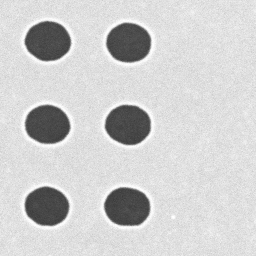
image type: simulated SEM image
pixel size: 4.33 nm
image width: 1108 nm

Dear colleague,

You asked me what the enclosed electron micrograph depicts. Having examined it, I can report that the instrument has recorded holes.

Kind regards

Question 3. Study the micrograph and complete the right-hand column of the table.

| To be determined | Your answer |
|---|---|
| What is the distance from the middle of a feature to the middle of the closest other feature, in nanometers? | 349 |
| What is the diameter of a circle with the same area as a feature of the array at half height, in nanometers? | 186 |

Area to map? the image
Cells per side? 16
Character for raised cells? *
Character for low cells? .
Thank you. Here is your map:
****************
**..************
**..***..*******
**..***..*******
****************
****************
****************
**..***..*******
**..***..*******
****************
****************
****************
**..***..*******
**..***..*******
****************
****************